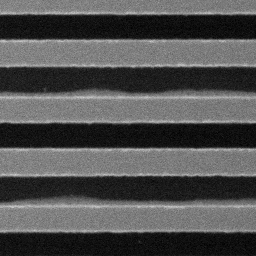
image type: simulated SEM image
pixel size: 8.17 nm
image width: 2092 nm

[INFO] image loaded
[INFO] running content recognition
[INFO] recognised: lines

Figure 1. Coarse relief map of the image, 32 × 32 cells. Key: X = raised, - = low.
XXXXXXXXXXXXXXXXXXXXXXXXXXXXXXXX
XXXXXXXXXXXXXXXXXXXXXXXXXXXXXXXX
--------------------------------
--------------------------------
--------------------------------
XXXXXXXXXXXXXXXXXXXXXXXXXXXXXXXX
XXXXXXXXXXXXXXXXXXXXXXXXXXXXXXXX
XXXXXXXXXXXXXXXXXXXXXXXXXXXXXXXX
--------------------------------
--------------------------------
--------------------------------
--------------------------------
XXXXXXXXXXXXXXXXXXXXXXXXXXXXXXXX
XXXXXXXXXXXXXXXXXXXXXXXXXXXXXXXX
XXXXXXXXXXXXXXXXXXXXXXXXXXXXXXXX
--------------------------------
--------------------------------
--------------------------------
--------------------------------
XXXXXXXXXXXXXXXXXXXXXXXXXXXXXXXX
XXXXXXXXXXXXXXXXXXXXXXXXXXXXXXXX
XXXXXXXXXXXXXXXXXXXXXXXXXXXXXXXX
--------------------------------
--------------------------------
--------------------------------
--------------------------------
XXXXXXXXXXXXXXXXXXXXXXXXXXXXXXXX
XXXXXXXXXXXXXXXXXXXXXXXXXXXXXXXX
XXXXXXXXXXXXXXXXXXXXXXXXXXXXXXXX
--------------------------------
--------------------------------
--------------------------------